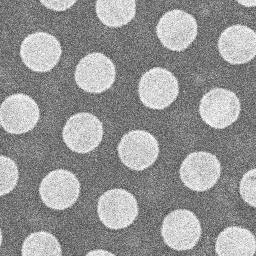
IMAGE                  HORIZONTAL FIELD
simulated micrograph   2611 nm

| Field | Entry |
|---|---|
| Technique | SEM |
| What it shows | a regular array of raised bodies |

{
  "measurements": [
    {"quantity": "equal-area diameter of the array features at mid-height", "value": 39.1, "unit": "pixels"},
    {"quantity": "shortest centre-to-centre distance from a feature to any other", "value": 620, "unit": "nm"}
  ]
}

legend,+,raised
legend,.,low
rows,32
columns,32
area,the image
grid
.....++++...+++++.............++
............+++++....++..+......
.............+++....++++........
....................+++++....++.
....++..............++++....++++
...++++.............++++...+++++
...+++++....................++++
...++++...++++..............+++.
....++....++++..................
.........+++++....++++..........
..........++++...+++++..........
...........+.....+++++....+++...
.+++..............++++...+++++..
+++++..............+.....+++++..
+++++....+++.............+++++..
++++....+++++.............+++...
.++.....+++++....+..............
........+++++..++++.............
.........+++...+++++............
...............+++++....+++.....
++..............+++....++++.....
++.....++..............++++....+
++...+++++.............++++...++
++...+++++..............++....++
.....+++++...+++..............++
......+++...+++++..............+
............+++++.....++........
.............++++....++++.......
..............+.....+++++....+..
....+++.............+++++..+++++
...++++..............+++...+++++
...+++++...++..............+++++